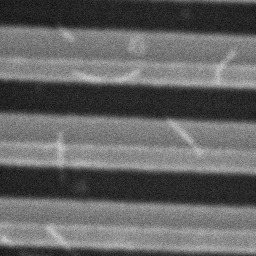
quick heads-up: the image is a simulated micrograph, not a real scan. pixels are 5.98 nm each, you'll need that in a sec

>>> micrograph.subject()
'lines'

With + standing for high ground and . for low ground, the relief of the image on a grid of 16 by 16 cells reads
................
................
++++++++++++++++
++++++++++++++++
++++++++++++++++
................
................
+++++++.........
++++++++++++++++
++++++++++++++++
.........+++++++
................
................
++++++++++++++++
++++++++++++++++
.........+++++++